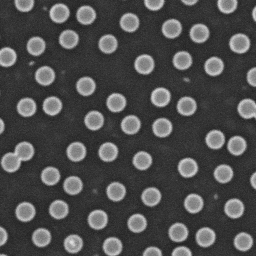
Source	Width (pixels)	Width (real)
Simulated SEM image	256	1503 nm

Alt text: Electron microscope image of a regular array of raised bodies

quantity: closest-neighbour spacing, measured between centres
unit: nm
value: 179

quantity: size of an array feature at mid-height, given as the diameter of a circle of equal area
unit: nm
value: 107